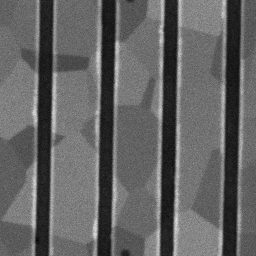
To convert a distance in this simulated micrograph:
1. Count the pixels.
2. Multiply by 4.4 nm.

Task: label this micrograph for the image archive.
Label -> one or a few lines or trenches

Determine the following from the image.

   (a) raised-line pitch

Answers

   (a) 275 nm